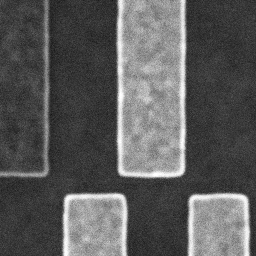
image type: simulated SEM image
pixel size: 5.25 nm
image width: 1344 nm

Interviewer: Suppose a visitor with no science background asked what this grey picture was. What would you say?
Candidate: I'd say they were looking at wiring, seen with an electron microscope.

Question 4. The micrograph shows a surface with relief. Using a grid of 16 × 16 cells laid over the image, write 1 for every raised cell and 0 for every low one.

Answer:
1110000011100000
1110000111100000
1110000111100000
1110000111100000
1110000111100000
1110000111100000
1110000111100000
1110000111100000
1110000111100000
1110000111100000
1110000011100000
0000000000000000
0000111100001110
0000111100001110
0000111100001110
0000111100001110